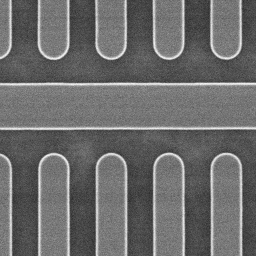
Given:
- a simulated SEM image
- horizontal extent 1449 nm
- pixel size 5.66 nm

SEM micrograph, groups of lines, slits or small figures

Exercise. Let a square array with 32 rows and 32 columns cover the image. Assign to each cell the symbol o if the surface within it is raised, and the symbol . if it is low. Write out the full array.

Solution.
o....oooo...oooo...oooo...oooo..
o....oooo...oooo...oooo...oooo..
o....oooo...oooo...oooo...oooo..
o....oooo...oooo...oooo...oooo..
o....oooo...oooo...oooo...oooo..
o....oooo...oooo...oooo...oooo..
o....ooo....ooo.....ooo....ooo..
................................
................................
................................
.....oooo....oooooooo..ooooooooo
oooooooooooooooooooooooooooooooo
oooooooooooooooooooooooooooooooo
oooooooooooooooooooooooooooooooo
oooooooooooooooooooooooooooooooo
oooooooooooooooooooooooooooooooo
................................
................................
................................
o.....oo.....oo.....oo.....oo...
o....oooo...oooo...oooo...oooo..
o....oooo...oooo...oooo...oooo..
o....oooo...oooo...oooo...oooo..
o....oooo...oooo...oooo...oooo..
o....oooo...oooo...oooo...oooo..
o....oooo...oooo...oooo...oooo..
o....oooo...oooo...oooo...oooo..
o....oooo...oooo...oooo...oooo..
o....oooo...oooo...oooo...oooo..
o....oooo...oooo...oooo...oooo..
o....oooo...oooo...oooo...oooo..
o....oooo...oooo...oooo...oooo..